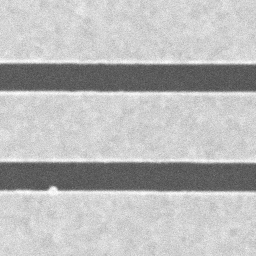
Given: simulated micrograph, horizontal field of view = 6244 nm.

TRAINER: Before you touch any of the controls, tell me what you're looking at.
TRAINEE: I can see lines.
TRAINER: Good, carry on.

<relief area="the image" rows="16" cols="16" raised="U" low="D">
UUUUUUUUUUUUUUUU
UUUUUUUUUUUUUUUU
UUUUUUUUUUUUUUUU
UUUUUUUUUUUUUUUU
DDDDDDDDDDDDDDDD
DDDDDDDDDDDDDDDD
UUUUUUUUUUUUUUUU
UUUUUUUUUUUUUUUU
UUUUUUUUUUUUUUUU
UUUUUUUUUUUUUUUU
DDDDDDDDDDDDDDDD
DDDDDDDDDDDDDDDD
UUUUUUUUUUUUUUUU
UUUUUUUUUUUUUUUU
UUUUUUUUUUUUUUUU
UUUUUUUUUUUUUUUU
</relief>